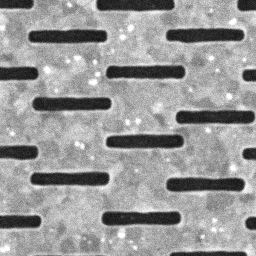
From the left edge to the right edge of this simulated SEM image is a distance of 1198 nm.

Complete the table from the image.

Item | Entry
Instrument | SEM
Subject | a regular array of holes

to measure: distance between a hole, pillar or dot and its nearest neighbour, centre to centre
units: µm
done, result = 0.326